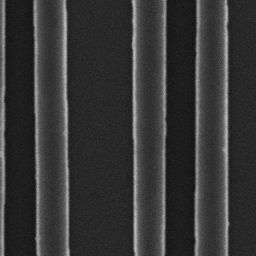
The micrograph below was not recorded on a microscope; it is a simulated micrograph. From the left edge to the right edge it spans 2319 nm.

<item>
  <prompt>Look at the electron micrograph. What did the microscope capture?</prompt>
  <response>lines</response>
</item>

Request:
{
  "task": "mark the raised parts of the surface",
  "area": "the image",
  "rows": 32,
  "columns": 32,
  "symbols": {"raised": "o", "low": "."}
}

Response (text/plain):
o...oooo.........oooo....ooo....
o...oooo.........oooo....ooo....
o...oooo.........oooo....ooo....
o...oooo.........oooo....ooo....
o...oooo.........oooo....ooo....
o...oooo.........oooo....ooo....
o...oooo.........oooo....ooo....
o...oooo.........oooo....ooo....
o...oooo.........oooo....ooo....
o...oooo.........oooo....ooo....
o...oooo.........oooo....ooo....
o...oooo.........oooo....ooo....
....oooo.........oooo....ooo....
o...oooo.........oooo....ooo....
o...oooo.........oooo....ooo....
o...oooo.........oooo....ooo....
o...oooo.........oooo....ooo....
....oooo.........oooo....ooo....
....oooo.........oooo....ooo....
....oooo.........oooo....ooo....
o....ooo.........oooo....ooo....
o....ooo.........oooo....ooo....
o....ooo.........oooo....ooo....
o....ooo.........oooo....ooo....
o....ooo.........oooo....ooo....
.....ooo.........oooo....ooo....
.....ooo.........oooo...oooo....
.....ooo.........oooo...oooo....
.....ooo.........oooo...oooo....
....oooo.........oooo....ooo....
.....ooo.........oooo...oooo....
.....oooo........oooo...oooo....